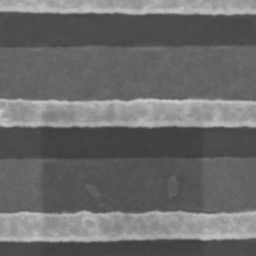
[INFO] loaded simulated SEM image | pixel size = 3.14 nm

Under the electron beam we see lines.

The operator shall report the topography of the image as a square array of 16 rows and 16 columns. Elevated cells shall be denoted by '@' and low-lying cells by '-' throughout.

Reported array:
@@@@@@@@@@@@@@@@
----------------
----------------
@@@@@@@@@@@@@@@@
@@@@@@@@@@@@@@@@
@@@@@@@@@@@@@@@@
@@@@@@@@@@@@@@@@
@@@@@@@@@@@@@@@@
----------------
----------------
@@@@@@@@@@@@@@@@
@@@@@@@@@@@@@@@@
@@@@@@@@@@@@@@@@
@@@@@@@@@@@@@@@@
@@@@@@@@@@@@@@@@
----------------